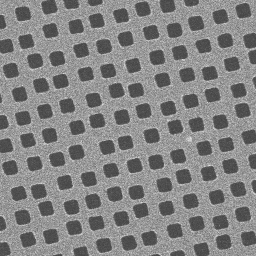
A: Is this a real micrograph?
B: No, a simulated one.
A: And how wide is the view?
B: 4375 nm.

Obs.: a regular array of holes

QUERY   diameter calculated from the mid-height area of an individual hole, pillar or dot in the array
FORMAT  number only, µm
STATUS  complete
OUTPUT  0.271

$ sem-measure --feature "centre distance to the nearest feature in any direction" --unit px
22.3